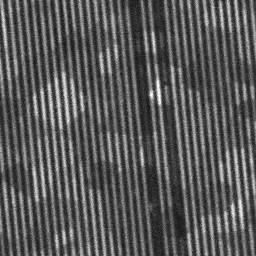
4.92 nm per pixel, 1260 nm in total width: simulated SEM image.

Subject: parallel lines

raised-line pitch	38.2	nm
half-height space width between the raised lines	27.6	nm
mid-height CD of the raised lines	0.0104	um